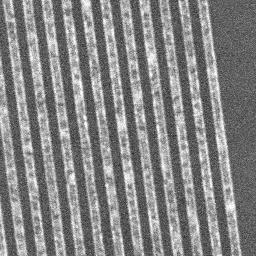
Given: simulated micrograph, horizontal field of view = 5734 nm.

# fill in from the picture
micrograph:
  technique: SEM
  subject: parallel lines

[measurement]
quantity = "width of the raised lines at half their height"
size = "172 nanometres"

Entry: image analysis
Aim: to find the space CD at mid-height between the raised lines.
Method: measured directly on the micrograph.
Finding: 0.258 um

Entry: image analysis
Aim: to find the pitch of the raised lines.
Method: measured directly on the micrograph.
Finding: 0.432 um